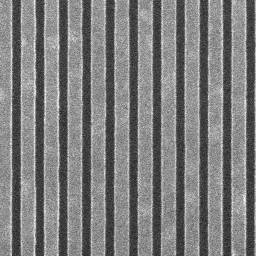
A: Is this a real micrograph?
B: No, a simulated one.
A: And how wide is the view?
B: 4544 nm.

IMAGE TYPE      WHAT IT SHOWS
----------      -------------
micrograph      parallel lines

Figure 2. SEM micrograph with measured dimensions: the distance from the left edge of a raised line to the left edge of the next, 416 nm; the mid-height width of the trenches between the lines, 171 nanometres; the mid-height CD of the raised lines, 244 nanometers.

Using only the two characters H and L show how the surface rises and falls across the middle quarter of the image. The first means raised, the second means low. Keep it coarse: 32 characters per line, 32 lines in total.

LHHHHLLHHHLLLHHHLLLHHHLLLHHHLLHH
LHHHHLLHHHLLLHHHLLLHHHLLLHHHLLHH
LHHHHLLHHHLLLHHHLLLHHHLLLHHHLLHH
LHHHLLLHHHLLLHHHLLLHHHLLLHHHLLHH
LHHHLLLHHHLLLHHHLLLHHHLLLHHHLLHH
LHHHLLLHHHLLLHHHLLLHHHLLLHHHLLHH
LHHHLLLHHHLLLHHHLLLHHHLLLHHHLLHH
LHHHLLLHHHLLLHHHLLLHHHLLLHHHLLHH
LHHHLLLHHHLLLHHHLLLHHHLLLHHHLLHH
LHHHLLLHHHLLLHHHLLLHHHLLLHHHLLHH
LHHHHLLHHHLLLHHHLLLHHHLLLHHHLLHH
LHHHHLLHHHLLLHHHLLLHHHLLLHHHLLHH
LHHHLLLHHHLLLHHHLLLHHHLLLHHHLLHH
LHHHLLLHHHLLLHHHLLLHHHLLLHHHLLHH
LHHHLLLHHHLLLHHHLLLHHHLLLHHHLLHH
LHHHLLLHHHLLLHHHLLLHHHLLLHHHLLHH
LHHHLLLHHHLLLHHHLLLHHHLLLHHHLLHH
LHHHLLLHHHLLLHHHLLLHHHLLLHHHLLHH
LHHHLLLHHHLLLHHHLLLHHHLLLHHHLLHH
LHHHLLLHHHLLLHHHLLLHHHLLLHHHLLHH
LHHHLLLHHHLLLHHHLLLHHHLLLHHHLLHH
LHHHLLLHHHLLLHHHLLLHHHLLLHHHLLLH
LHHHLLLHHHLLLHHHLLLHHHLLLHHHLLHH
LHHHLLLHHHLLLHHHLLLHHHLLLHHHLLHH
LHHHLLLHHHLLLHHHLLLHHHLLLHHHLLHH
LHHHLLLHHHLLLHHHLLLHHHLLLHHHLLHH
LHHHLLLHHHLLLHHHLLLHHHLLLHHHLLHH
LHHHLLLHHHLLLHHHLLLHHHLLLHHHLLHH
LHHHLLLHHHLLLHHHLLLHHHLLLHHHLLHH
LHHHLLLHHHLLLHHHLLLHHHLLLHHHLLHH
LHHHLLLHHHLLLHHHLLLHHHLLLHHHLLHH
LHHHLLLHHHLLLHHHLLLHHHLLLHHHLLHH